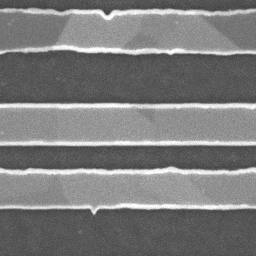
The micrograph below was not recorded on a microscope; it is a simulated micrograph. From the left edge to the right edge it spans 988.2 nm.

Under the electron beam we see one or a few lines or trenches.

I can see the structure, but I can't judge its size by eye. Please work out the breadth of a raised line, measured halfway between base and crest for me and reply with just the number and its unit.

39 pixels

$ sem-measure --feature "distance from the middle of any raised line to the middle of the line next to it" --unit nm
304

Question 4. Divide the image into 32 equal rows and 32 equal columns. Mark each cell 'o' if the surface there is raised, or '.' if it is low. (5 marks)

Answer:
................................
ooooooo.ooooo...ooooooo.oo...ooo
oooooooooooooooooooooooooooooooo
oooooooooooooooooooooooooooooooo
oooooooooooooooooooooooooooooooo
oooooooooooooooooooooooooooooooo
o..............ooo.ooo.ooooooooo
................................
................................
................................
................................
................................
................................
oooooooooooooooooooooooooooooooo
oooooooooooooooooooooooooooooooo
oooooooooooooooooooooooooooooooo
oooooooooooooooooooooooooooooooo
oooooooooooooooooooooooooooooooo
................................
................................
................................
oo.oooooooooooooooooooooo..ooooo
oooooooooooooooooooooooooooooooo
oooooooooooooooooooooooooooooooo
oooooooooooooooooooooooooooooooo
oooooooooooooooooooooooooooooooo
................................
................................
................................
................................
................................
................................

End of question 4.